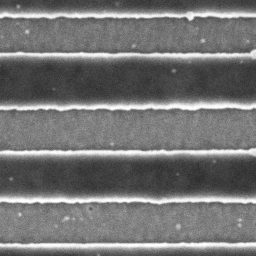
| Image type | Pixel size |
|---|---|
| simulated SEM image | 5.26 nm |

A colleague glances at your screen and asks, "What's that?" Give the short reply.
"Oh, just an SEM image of lines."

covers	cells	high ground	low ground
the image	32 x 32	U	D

UUUUUUUUUUUUUUUUUUUUUUUUUUUUUUUU
UUUUUUUUUUUUUUUUUUUUUUUUUUUUUUUU
DDDDDDDDDDDDDDDDDDDDDDDDDDDDDDDD
DDDDDDDDDDDDDDDDDDDDDDDDDDDDDDDD
DDDDDDDDDDDDDDDDDDDDDDDDDDDDDDDD
DDDDDDDDDDDDDDDDDDDDDDDDDDDDDDDD
DDDDDDDDDDDDDDDDDDDDDDDDDDDDDDDU
UUUUUUUUUUUUUUUUUUUUUUUUUUUUUUUU
UUUUUUUUUUUUUUUUUUUUUUUUUUUUUUUU
UUUUUUUUUUUUUUUUUUUUUUUUUUUUUUUU
UUUUUUUUUUUUUUUUUUUUUUUUUUUUUUUU
UUUUUUUUUUUUUUUUUUUUUUUUUUUUUUUU
UUUUUUUUUUUUUUUUUUUUUUUUUUUUUUUU
UUUUUUDUUUUUDUUUUUDUUDDUUDDDDDUD
DDDDDDDDDDDDDDDDDDDDDDDDDDDDDDDD
DDDDDDDDDDDDDDDDDDDDDDDDDDDDDDDD
DDDDDDDDDDDDDDDDDDDDDDDDDDDDDDDD
DDDDDDDDDDDDDDDDDDDDDDDDDDDDDDDD
DDDDDDDDDDDDDDDDDDDDDDDDDDDDDDDD
UUUUUUUUUUUUUUUUUUUUUUUUUUUUUUUU
UUUUUUUUUUUUUUUUUUUUUUUUUUUUUUUU
UUUUUUUUUUUUUUUUUUUUUUUUUUUUUUUU
UUUUUUUUUUUUUUUUUUUUUUUUUUUUUUUU
UUUUUUUUUUUUUUUUUUUUUUUUUUUUUUUU
UUUUUUUUUUUUUUUUUUUUUUUUUUUUUUUU
DDDDDDDDDDDDDDDDDDDDDDDDDDDDDDDD
DDDDDDDDDDDDDDDDDDDDDDDDDDDDDDDD
DDDDDDDDDDDDDDDDDDDDDDDDDDDDDDDD
DDDDDDDDDDDDDDDDDDDDDDDDDDDDDDDD
DDDDDDDDDDDDDDDDDDDDDDDDDDDDDDDD
DDDDDDDDDDDDDDDDDDDDDDDDDUUUDDDU
UUUUUUUUUUUUUUUUUUUUUUUUUUUUUUUU